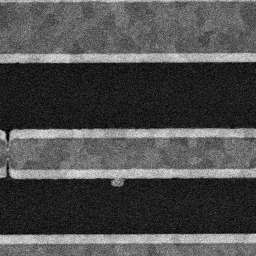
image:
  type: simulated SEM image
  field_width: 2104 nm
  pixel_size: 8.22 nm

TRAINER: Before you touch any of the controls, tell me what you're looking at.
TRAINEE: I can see one or a few lines or trenches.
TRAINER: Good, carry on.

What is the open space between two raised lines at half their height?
0.592 micrometres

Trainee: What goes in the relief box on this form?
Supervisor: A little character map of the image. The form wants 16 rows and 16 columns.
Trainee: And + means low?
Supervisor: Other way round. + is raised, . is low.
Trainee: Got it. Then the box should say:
++++++++++++++++
++++++++++++++++
++++++++++++++++
++++++++++++++++
................
................
................
................
.+++++++++++++++
++++++++++++++++
++++++++++++++++
................
................
................
................
++++++++++++++++